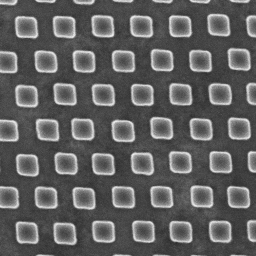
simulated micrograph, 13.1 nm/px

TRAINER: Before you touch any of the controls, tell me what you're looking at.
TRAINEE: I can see a regular array of raised bodies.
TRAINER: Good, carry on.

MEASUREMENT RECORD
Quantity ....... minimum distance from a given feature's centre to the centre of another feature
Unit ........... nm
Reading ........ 500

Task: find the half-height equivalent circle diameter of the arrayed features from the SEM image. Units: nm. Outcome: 297